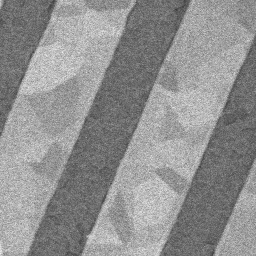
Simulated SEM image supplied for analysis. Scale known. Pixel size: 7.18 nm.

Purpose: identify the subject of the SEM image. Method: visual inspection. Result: one or a few lines or trenches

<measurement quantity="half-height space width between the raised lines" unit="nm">380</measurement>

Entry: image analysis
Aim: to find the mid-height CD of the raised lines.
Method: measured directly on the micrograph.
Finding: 0.493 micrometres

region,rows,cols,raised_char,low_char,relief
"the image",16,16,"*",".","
....****....****
...*****...*****
...****....*****
..*****...*****.
..****....*****.
.*****....****..
.*****...*****..
.****....****...
*****...*****...
****....*****...
****....****....
***....*****...*
***....****....*
***...*****....*
**....****....**
**...*****....**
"